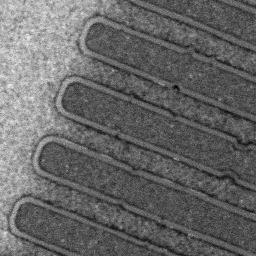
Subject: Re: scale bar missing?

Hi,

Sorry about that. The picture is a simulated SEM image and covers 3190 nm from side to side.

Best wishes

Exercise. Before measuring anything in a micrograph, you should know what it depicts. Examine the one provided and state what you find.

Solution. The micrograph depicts one or a few lines or trenches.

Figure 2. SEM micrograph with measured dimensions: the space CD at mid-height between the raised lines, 334 nm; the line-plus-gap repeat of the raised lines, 797 nanometres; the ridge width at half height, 0.47 micrometres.